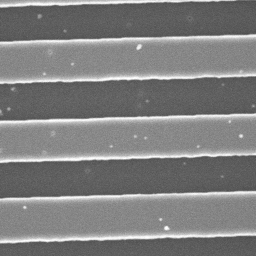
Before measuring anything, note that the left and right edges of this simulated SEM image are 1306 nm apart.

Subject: lines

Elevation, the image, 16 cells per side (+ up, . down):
................
................
....++++++++++++
++++++++++++++++
++++++++++++++++
................
................
...+++++++++++++
++++++++++++++++
++++++++++++++++
................
................
++++++++++++++++
++++++++++++++++
++++++++++++++++
................